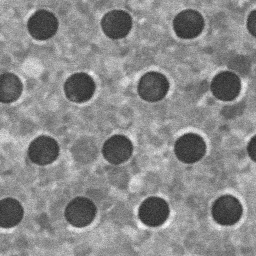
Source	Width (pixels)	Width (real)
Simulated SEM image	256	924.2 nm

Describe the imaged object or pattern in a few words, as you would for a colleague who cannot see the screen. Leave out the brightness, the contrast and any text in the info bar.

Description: a regular array of holes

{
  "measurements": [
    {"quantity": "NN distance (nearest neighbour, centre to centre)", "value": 260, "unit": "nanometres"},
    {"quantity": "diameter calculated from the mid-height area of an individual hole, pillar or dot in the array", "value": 32.8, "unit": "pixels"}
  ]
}